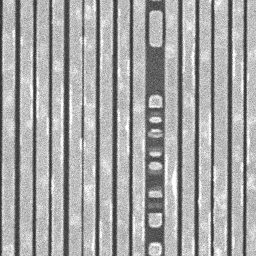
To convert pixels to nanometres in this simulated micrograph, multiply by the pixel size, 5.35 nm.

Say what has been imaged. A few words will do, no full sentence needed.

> parallel lines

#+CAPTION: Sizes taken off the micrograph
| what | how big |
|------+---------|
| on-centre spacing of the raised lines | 0.0875 um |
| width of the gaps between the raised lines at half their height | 0.0207 um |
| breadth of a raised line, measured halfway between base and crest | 65.6 nanometers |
